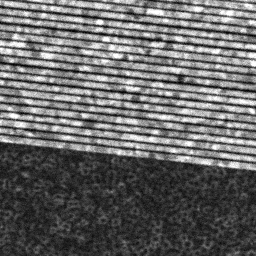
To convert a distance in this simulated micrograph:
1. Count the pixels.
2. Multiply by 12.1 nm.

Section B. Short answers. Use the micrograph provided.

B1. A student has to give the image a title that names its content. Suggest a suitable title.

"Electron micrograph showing parallel lines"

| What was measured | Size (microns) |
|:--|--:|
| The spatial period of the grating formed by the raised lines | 0.0956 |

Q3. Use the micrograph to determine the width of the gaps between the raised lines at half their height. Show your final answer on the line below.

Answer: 36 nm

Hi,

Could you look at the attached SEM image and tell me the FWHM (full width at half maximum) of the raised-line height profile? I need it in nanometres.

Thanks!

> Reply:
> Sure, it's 62.9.